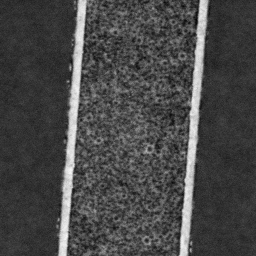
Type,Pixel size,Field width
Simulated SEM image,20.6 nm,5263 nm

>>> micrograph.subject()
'one or a few lines or trenches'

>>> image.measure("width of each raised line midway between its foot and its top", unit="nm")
2490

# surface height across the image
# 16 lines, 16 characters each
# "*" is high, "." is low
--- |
.....********...
.....********...
.....********...
.....*******....
.....*******....
.....*******....
.....*******....
.....*******....
.....*******....
....********....
....********....
....********....
....********....
....********....
....********....
....*******.....